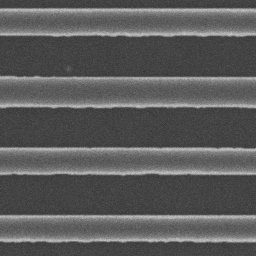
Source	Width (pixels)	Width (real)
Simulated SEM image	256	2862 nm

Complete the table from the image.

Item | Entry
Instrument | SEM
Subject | lines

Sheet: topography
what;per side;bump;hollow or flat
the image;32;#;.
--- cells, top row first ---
................................
################################
################################
################################
......###........#.......#......
................................
................................
................................
................................
................................
################################
################################
################################
................................
................................
................................
................................
................................
................................
################################
################################
################################
................................
................................
................................
................................
................................
################################
################################
################################
................................
................................